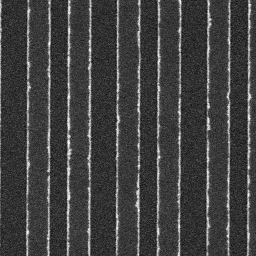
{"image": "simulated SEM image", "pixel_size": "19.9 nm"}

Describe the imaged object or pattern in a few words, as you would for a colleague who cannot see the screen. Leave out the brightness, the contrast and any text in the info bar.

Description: parallel lines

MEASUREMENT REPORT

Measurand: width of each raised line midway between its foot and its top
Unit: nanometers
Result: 441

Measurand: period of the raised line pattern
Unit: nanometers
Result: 896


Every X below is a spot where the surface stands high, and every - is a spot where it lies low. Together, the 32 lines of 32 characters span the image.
---XXX---XX----XX---XXX---XXX--X
----XX---XX----XX---XXX---XXX--X
----XX---XX----XX---XXX---XXX--X
---XXX---XX----XX---XXX---XXX--X
---XXX---XX----XX---XXX---XXX--X
---XXX---XX----XX---XXX---XXX--X
---XXX---XX----XX---XXX---XXX--X
---XXX---XX----XX---XXX---XXX--X
----XX---XX----XX---XXX---XXX--X
----XX---XX----XX---XXX---XXX--X
----XX---XX----XX---XX----XXX--X
---XXX---XX----XX---XX----XXX--X
----XX---XX----XX---XX----XXX--X
---XXX---XX----XX---XX----XXX--X
---XXX---XX----XX---XX----XXX--X
---XXX---XX----XX---XX----XXX--X
---XXX---XX----XX---XX----XXX--X
---XXX---XX----XX---XX----XXX--X
---XXX---XX----XX---XX----XXX--X
---XXX---XX----XX---XX----XXX--X
---XXX---XX----XX---XX----XXX--X
---XXX---XX----XX---XX----XXX--X
---XXX---XX----XX---XX----XXX--X
---XXX---XX----XX---XX----XXX--X
---XXX--XXX----XX---XX----XXX--X
---XXX---XX----XX---XX----XXX--X
---XXX---XX----XX---XX----XXX--X
---XXX--XXX----XX---XX----XXX--X
---XXX---XX----XX---XX----XXX--X
---XXX---XX----XX---XX----XXX--X
---XXX--XXX----XX---XX----XXX--X
---XXX---XX----XX---XX----XXX--X